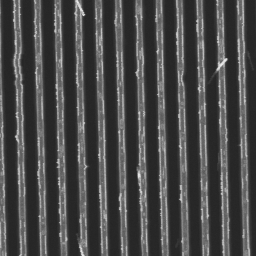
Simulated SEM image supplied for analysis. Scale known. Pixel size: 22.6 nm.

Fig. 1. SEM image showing parallel lines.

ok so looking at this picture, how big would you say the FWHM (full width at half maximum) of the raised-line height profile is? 178 nm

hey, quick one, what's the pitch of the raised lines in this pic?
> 458 nm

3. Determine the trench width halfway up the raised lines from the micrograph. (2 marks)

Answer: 265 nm